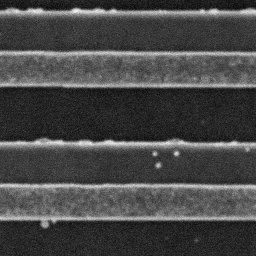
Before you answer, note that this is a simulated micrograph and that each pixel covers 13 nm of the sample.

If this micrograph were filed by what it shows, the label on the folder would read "lines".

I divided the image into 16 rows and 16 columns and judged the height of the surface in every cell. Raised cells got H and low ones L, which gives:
LLLLLLLLLLLLLLLL
HHHHHHHHHHHHHHHH
HHHHHHHHHHHHHHHH
HHHHHHHHHHHHHHHH
HHHHHHHHHHHHHHHH
LLLLLLLLLLLLLLLL
LLLLLLLLLLLLLLLL
LLLLLLLLLLLLLLLL
LLLLLLLLLLLLLLLL
HHHHHHHHHHHHHHHH
HHHHHHHHHHHHHHHH
HHHHHHHHHHHHHHHH
HHHHHHHHHHHHHHHH
HHHHHHHHHHHHHHHH
LLLLLLLLLLLLLLLL
LLLLLLLLLLLLLLLL